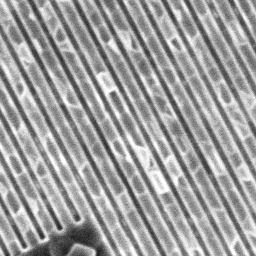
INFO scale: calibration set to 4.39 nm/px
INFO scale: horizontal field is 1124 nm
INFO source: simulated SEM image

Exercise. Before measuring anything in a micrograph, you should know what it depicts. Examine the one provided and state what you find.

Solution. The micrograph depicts parallel lines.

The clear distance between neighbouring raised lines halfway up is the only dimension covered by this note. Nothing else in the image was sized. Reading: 27.2 nanometers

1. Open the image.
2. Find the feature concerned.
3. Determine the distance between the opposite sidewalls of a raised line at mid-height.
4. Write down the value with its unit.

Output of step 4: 57.9 nm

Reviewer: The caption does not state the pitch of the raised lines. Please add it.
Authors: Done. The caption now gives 86.8 nm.